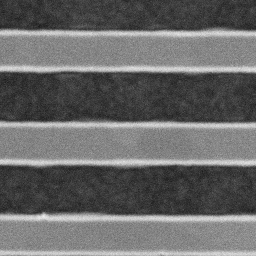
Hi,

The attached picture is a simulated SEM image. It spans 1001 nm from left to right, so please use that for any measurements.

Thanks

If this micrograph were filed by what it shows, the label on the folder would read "one or a few lines or trenches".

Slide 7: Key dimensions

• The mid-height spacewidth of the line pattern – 0.211 µm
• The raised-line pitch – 361 nm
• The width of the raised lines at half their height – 149 nm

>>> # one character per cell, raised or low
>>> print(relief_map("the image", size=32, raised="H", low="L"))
LLLLLLLLLLLLLLLLLLLLLLLLLLLLLLLL
LLLLLLLLLLLLLLLLLLLLLLLLLLLLLLLL
LLLLLLLLLLLLLLLLLLLLLLLLLLLLLLLL
LLLLLLLLLLLLLLLLLLLLLLLLLLLLLLLL
HHHHHHHHHHHHHHHHHHHHHHHHHHHHHHHH
HHHHHHHHHHHHHHHHHHHHHHHHHHHHHHHH
HHHHHHHHHHHHHHHHHHHHHHHHHHHHHHHH
HHHHHHHHHHHHHHHHHHHHHHHHHHHHHHHH
HHHHHHHHHHHHHHHHHHHHHHHHHHHHHHHH
LLLLLLLLLLLLLLLLLLLLLLLLLLLLLLLL
LLLLLLLLLLLLLLLLLLLLLLLLLLLLLLLL
LLLLLLLLLLLLLLLLLLLLLLLLLLLLLLLL
LLLLLLLLLLLLLLLLLLLLLLLLLLLLLLLL
LLLLLLLLLLLLLLLLLLLLLLLLLLLLLLLL
LLLLLLLLLLLLLLLLLLLLLLLLLLLLLLLL
HHHHHHHHHHHLLLLLLLLLLLLLLLLLLLLL
HHHHHHHHHHHHHHHHHHHHHHHHHHHHHHHH
HHHHHHHHHHHHHHHHHHHHHHHHHHHHHHHH
HHHHHHHHHHHHHHHHHHHHHHHHHHHHHHHH
HHHHHHHHHHHHHHHHHHHHHHHHHHHHHHHH
LLLLLLLLLLLLLLLLLLLLLLLLLLLLLHHH
LLLLLLLLLLLLLLLLLLLLLLLLLLLLLLLL
LLLLLLLLLLLLLLLLLLLLLLLLLLLLLLLL
LLLLLLLLLLLLLLLLLLLLLLLLLLLLLLLL
LLLLLLLLLLLLLLLLLLLLLLLLLLLLLLLL
LLLLLLLLLLLLLLLLLLLLLLLLLLLLLLLL
LLLLLLLLLLLLLLLLLLLLLLLLLLLLLLLL
HHHHHHHHHHHHHHHHHHHHHHHHHHHHHHHH
HHHHHHHHHHHHHHHHHHHHHHHHHHHHHHHH
HHHHHHHHHHHHHHHHHHHHHHHHHHHHHHHH
HHHHHHHHHHHHHHHHHHHHHHHHHHHHHHHH
HHHHHHHHHHHHHHHHHHHHHHHHHHHHHHHH